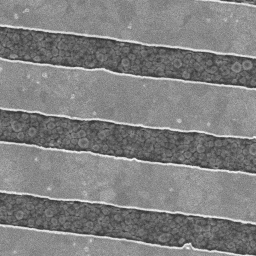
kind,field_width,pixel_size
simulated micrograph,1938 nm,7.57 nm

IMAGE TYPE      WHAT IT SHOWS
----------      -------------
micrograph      one or a few lines or trenches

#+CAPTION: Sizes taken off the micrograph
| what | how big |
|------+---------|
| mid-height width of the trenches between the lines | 249 nanometers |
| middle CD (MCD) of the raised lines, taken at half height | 0.374 µm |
